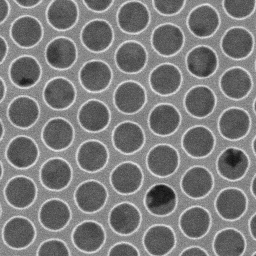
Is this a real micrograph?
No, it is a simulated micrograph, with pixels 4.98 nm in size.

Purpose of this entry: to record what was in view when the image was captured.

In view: a regular array of raised bodies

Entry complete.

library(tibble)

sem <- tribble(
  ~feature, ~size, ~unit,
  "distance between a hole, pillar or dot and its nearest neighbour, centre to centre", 200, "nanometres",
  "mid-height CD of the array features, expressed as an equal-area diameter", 0.164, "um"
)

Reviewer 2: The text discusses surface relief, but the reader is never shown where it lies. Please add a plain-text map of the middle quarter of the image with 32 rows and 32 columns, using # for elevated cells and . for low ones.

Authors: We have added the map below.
##...######..#######...#####...#
....########..#####...#######..#
....########..........#######...
....########.........########...
##..########...###...########...
###..######...#####...#######...
###...####...#######..######...#
###.........########....###....#
###..........#######..........##
##....###....#######..........##
##..#######..#######...####...##
....#######...#####...######...#
....#######.....#....########..#
...########..........########...
#...#######....##....########...
##..#######..######..########...
##...####...########..######...#
##..........########...####...##
##..........########..........##
##...####...########.........###
#...######...#######...####...##
...########...#####...######..##
...########..........########..#
...########..........########...
#..########.....#....########...
##..######...######..########...
##...####...#######..#######...#
##..........########..#####...##
##..........########.........###
##...####...########.........###
#...######..#######...####...###
...########..#####...######...##